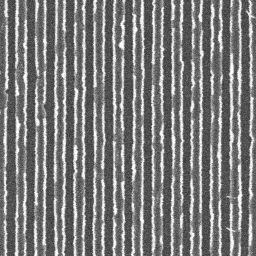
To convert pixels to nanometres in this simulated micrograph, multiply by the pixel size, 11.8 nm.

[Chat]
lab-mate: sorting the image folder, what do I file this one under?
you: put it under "parallel lines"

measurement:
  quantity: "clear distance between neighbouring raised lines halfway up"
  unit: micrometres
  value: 0.101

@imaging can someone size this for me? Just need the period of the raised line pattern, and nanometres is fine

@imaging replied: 231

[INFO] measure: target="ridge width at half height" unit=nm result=127